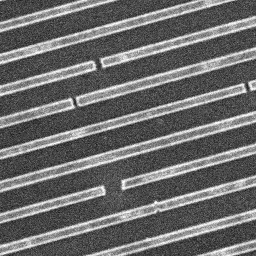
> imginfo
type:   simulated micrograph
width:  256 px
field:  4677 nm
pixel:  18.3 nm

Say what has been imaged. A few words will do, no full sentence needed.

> parallel lines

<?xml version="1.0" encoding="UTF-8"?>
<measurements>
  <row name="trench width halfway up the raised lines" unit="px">22.9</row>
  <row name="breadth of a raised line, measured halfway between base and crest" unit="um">0.145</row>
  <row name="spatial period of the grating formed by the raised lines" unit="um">0.565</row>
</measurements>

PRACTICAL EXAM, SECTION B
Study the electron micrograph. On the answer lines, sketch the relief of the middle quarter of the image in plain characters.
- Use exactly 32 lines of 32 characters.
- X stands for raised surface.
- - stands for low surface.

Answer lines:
---XXXXX------------------------
XXXXXXX----------------------XXX
XXXX---------------------XXXXXXX
---------------------XXXXXXXX---
------------------XXXXXXXX------
--------------XXXXXXXX----------
----------XXXXXXXX--------------
-------XXXXXXXX-----------------
---XXXXXXXX---------------------
XX-XXXX----------------------XXX
XX-----------------------XXXXXXX
---------------------XXXXXXXX---
------------------XXXXXXX-------
--------------XXXXXXX-----------
----------XXXXXXXX--------------
-------XXXXXXX------------------
---XXXXXXX---------------------X
XXXXXXX---------------------XXXX
XXX---------------------XXXXXXXX
--------------------XXXXXXXXX---
-----------------XXXXXXXX-------
-------------XXXXXXXX-----------
---------XXXXXXXXX--------------
------XXXXXXXX------------------
--XXXXXXXX----------------------
XXXXXXX----------------------XXX
XXX----------------------XXXXXXX
---------------------XXXXXXXX---
------------------XXXXXXX-------
---------------XXXXXX-----------
---------------XXX--------------
-------XXX----------------------